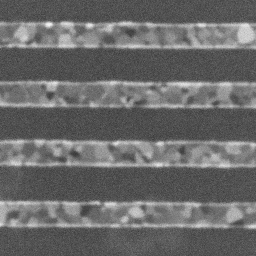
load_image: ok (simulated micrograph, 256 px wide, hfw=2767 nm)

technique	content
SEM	lines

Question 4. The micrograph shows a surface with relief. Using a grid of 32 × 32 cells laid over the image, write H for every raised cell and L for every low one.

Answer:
LLLLLLLLLLLLLLLLLLLLLLLLLLLLLLLL
LLLLLLLLLLLLLLLLLLLLLLLLLLLLLLLL
LLLLLLLLLLLLLLLLLLLLLLLLLLLLLLLL
HHHHHHHHHHHHHHHHHHHHHHHHHHHHHHHH
HHHHHHHHHHHHHHHHHHHHHHHHHHHHHHHH
HHHHHHHHHHHHHHHHHHHHHHHHHHHHHHHH
LLLLLLLLLLLLLLLLLLLLLLLLLLLLLLLL
LLLLLLLLLLLLLLLLLLLLLLLLLLLLLLLL
LLLLLLLLLLLLLLLLLLLLLLLLLLLLLLLL
LLLLLLLLLLLLLLLLLLLLLLLLLLLLLLLL
HHHHHHHHHLHHHHHHHLLLLLLLLLLLLLLL
HHHHHHHHHHHHHHHHHHHHHHHHHHHHHHHH
HHHHHHHHHHHHHHHHHHHHHHHHHHHHHHHH
LLLLLLLLLLLLLLLLLLLLLLLLLLLLLLLL
LLLLLLLLLLLLLLLLLLLLLLLLLLLLLLLL
LLLLLLLLLLLLLLLLLLLLLLLLLLLLLLLL
LLLLLLLLLLLLLLLLLLLLLLLLLLLLLLLL
LLLLLLLLLLLLLLLLLLLLLLLLLLLLLLLL
HHHHHHHHHHHHHHHHHHHHHHHHHHHHHHHH
HHHHHHHHHHHHHHHHHHHHHHHHHHHHHHHH
LLLLHHHLLLLLHHHHHHHHHHHHHHHHHHHH
LLLLLLLLLLLLLLLLLLLLLLLLLLLLLLLL
LLLLLLLLLLLLLLLLLLLLLLLLLLLLLLLL
LLLLLLLLLLLLLLLLLLLLLLLLLLLLLLLL
LLLLLLLLLLLLLLLLLLLLLLLLLLLLLLLL
HHHHHHHHHLHHHLLLHHHLLLLLLLLLLLLL
HHHHHHHHHHHHHHHHHHHHHHHHHHHHHHHH
HHHHHHHHHHHHHHHHHHHHHHHHHHHHHHHH
LLLLLLLLLLLLLLLLLLLLLLLLLLLLLLLL
LLLLLLLLLLLLLLLLLLLLLLLLLLLLLLLL
LLLLLLLLLLLLLLLLLLLLLLLLLLLLLLLL
LLLLLLLLLLLLLLLLLLLLLLLLLLLLLLLL